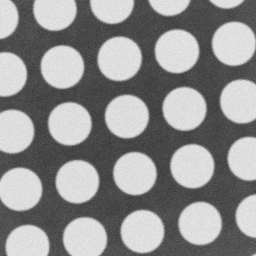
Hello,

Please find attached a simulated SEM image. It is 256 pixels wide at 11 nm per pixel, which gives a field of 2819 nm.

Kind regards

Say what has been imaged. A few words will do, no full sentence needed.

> an array of small figures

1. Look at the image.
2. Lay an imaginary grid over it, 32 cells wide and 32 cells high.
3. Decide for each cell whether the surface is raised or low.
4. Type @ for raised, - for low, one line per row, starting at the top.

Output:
@@--@@@@@--@@@@@@--@@@@@---@@@--
@@--@@@@@@--@@@@----@@@---------
@@---@@@@----@@-----------------
@@----@@-------------------@@@@-
@-------------------@@@@---@@@@@
-------------@@@@---@@@@@--@@@@@
------@@@@--@@@@@@-@@@@@@--@@@@@
@@@--@@@@@--@@@@@@--@@@@@--@@@@-
@@@--@@@@@--@@@@@---@@@@--------
@@@--@@@@@---@@@@---------------
@@@---@@@--------------------@@@
@@-------------------@@@@---@@@@
--------------@@@@---@@@@@--@@@@
-------@@@@--@@@@@--@@@@@@--@@@@
@@@---@@@@@--@@@@@@--@@@@@--@@@@
@@@@--@@@@@--@@@@@---@@@@-------
@@@@--@@@@@---@@@@--------------
@@@@---@@@--------------------@@
@@@--------------------@@----@@@
---------------@@@----@@@@---@@@
--------@@@---@@@@@--@@@@@@--@@@
-@@@---@@@@@--@@@@@@-@@@@@@--@@@
@@@@@--@@@@@--@@@@@---@@@@-----@
@@@@@--@@@@@---@@@@-------------
@@@@@---@@@@-------------------@
-@@@--------------------@@----@@
-----------------@@----@@@@---@@
---------@@@----@@@@--@@@@@@--@@
--@@@---@@@@@--@@@@@--@@@@@@--@@
-@@@@@--@@@@@--@@@@@---@@@@----@
-@@@@@--@@@@@---@@@@----@@------
-@@@@@---@@@@----@--------------